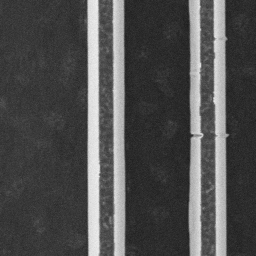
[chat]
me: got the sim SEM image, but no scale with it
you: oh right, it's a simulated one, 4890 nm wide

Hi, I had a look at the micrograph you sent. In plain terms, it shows one or a few lines or trenches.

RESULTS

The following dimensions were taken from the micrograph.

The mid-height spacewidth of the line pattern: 1460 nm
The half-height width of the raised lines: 485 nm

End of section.